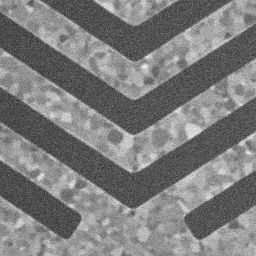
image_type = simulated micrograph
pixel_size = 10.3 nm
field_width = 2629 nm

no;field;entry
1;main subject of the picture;groups of lines, slits or small figures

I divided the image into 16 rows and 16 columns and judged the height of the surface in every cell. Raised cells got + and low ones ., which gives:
+++....+++....++
.++++.......++++
...+++.....+++..
+...++++.++++...
++....+++++....+
++++...+++...+++
..+++.......+++.
...++++...++++..
+....+++++++....
+++...+++++...++
.+++....+....+++
..++++.....++++.
....+++..++++...
++...+++++++...+
+++..+++++++.+++
++++++++++++++++